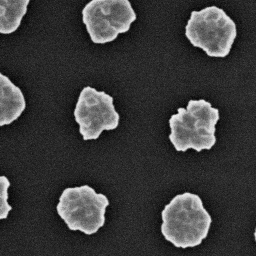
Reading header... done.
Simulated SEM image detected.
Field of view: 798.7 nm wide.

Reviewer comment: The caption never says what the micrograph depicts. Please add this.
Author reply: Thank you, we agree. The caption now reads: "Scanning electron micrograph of raised bodies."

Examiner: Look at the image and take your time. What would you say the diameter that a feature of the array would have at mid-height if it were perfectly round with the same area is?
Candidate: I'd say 150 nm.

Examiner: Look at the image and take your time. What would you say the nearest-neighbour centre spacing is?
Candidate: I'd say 302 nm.